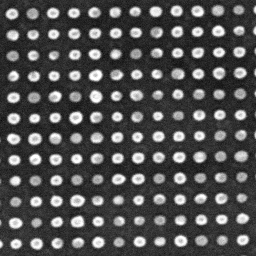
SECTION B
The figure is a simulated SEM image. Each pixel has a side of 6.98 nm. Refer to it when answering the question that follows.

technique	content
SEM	a regular array of raised bodies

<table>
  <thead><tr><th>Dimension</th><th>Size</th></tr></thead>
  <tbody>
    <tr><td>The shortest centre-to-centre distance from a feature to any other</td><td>142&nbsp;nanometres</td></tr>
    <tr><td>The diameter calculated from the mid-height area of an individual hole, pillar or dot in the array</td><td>0.0717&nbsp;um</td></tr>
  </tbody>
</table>